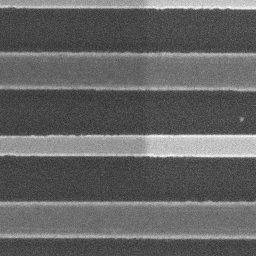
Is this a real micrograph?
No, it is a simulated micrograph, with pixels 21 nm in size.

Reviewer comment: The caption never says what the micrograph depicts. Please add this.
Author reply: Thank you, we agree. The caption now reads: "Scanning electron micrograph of lines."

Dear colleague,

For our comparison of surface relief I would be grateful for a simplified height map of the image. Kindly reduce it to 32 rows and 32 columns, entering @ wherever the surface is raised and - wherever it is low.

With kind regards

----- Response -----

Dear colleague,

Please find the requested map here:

@@@@@@@@@@@@@@@@@@@@@@@@@@@@@@@@
--------------------------------
--------------------------------
--------------------------------
--------------------------------
--------------------------------
--------------------------------
@@@@@@@@@@@@@@@@@@@@@@@@@@@@@@@@
@@@@@@@@@@@@@@@@@@@@@@@@@@@@@@@@
@@@@@@@@@@@@@@@@@@@@@@@@@@@@@@@@
@@@@@@@@@@@@@@@@@@@@@@@@@@@@@@@@
--------------------------------
--------------------------------
--------------------------------
--------------------------------
--------------------------------
--------------------------------
@@@@@@@@@@@@@@@@@@@@@@@@@@@@@@@@
@@@@@@@@@@@@@@@@@@@@@@@@@@@@@@@@
-------------------@@@@@@@@@@@@@
--------------------------------
--------------------------------
--------------------------------
--------------------------------
--------------------------------
@@@@@@@@@@@@@@@@@@@@@@@@@@@@@@@@
@@@@@@@@@@@@@@@@@@@@@@@@@@@@@@@@
@@@@@@@@@@@@@@@@@@@@@@@@@@@@@@@@
@@@@@@@@@@@@@@@@@@@@@@@@@@@@@@@@
@@@@@@@@@@@@@@@@@@@@@@@@@@@@@@@@
--------------------------------
--------------------------------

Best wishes